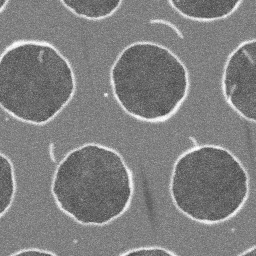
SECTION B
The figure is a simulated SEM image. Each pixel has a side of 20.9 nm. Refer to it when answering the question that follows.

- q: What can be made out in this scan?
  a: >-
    holes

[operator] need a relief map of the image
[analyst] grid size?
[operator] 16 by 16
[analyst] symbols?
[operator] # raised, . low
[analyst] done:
####...####....#
################
################
....####...####.
....###.....##..
.....##.....##..
....####...####.
##.#############
################
#####..#####..##
.###....###....#
.##.....###....#
.###....###....#
#####..#####..##
################
################